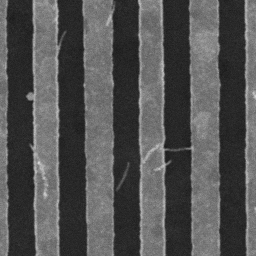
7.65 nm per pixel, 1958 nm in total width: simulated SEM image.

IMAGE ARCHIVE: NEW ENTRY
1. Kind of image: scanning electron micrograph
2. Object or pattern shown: lines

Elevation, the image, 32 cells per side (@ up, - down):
@---@@@---@@@@---@@@----@@@----@
@---@@@---@@@@---@@@----@@@----@
@---@@@----@@@---@@@----@@@----@
@---@@@----@@@---@@@----@@@----@
@---@@@----@@@---@@@----@@@----@
@---@@@----@@@----@@----@@@----@
@---@@@----@@@---@@@----@@@----@
@---@@@----@@@----@@----@@@----@
@---@@@----@@@----@@----@@@----@
@---@@@----@@@---@@@----@@@----@
@---@@@----@@@---@@@----@@@@---@
@---@@@----@@@---@@@----@@@----@
@---@@@----@@@---@@@----@@@----@
@---@@@----@@@----@@----@@@----@
@---@@@----@@@----@@----@@@----@
@---@@@----@@@----@@----@@@----@
@---@@@----@@@----@@----@@@----@
@---@@@----@@@----@@----@@@----@
@---@@@----@@@----@@@---@@@----@
@---@@@----@@@----@@----@@@----@
@---@@@----@@@----@@@---@@@----@
@---@@@----@@@----@@----@@@----@
@---@@@----@@@----@@----@@@----@
@---@@@----@@@----@@@---@@@----@
@---@@@----@@@----@@@---@@@----@
@---@@@----@@@----@@@---@@@----@
@---@@@----@@@----@@@---@@@----@
@---@@@----@@@----@@----@@@----@
@----@@----@@@----@@@---@@@----@
@---@@@----@@@----@@@---@@@----@
@----@@----@@@----@@@---@@@----@
@----@@----@@@----@@----@@@----@